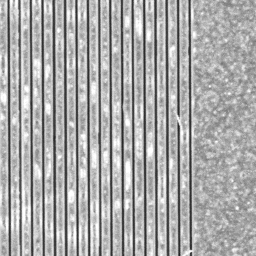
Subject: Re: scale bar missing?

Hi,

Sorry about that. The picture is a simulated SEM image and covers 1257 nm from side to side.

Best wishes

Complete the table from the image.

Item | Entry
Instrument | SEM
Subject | parallel lines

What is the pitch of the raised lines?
55.7 nanometers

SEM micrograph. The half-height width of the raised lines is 39.9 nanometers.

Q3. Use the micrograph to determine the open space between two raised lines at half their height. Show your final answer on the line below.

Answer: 13.5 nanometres